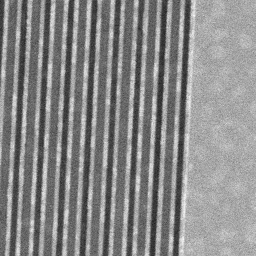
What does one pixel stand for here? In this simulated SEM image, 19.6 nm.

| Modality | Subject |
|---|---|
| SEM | parallel lines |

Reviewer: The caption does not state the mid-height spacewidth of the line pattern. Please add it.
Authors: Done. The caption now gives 132 nanometres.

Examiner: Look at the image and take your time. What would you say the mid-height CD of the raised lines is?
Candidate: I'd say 66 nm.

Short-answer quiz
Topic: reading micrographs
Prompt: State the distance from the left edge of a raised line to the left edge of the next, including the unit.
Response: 0.227 µm